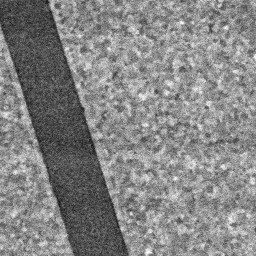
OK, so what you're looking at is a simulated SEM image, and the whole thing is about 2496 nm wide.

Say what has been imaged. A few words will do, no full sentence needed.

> one or a few lines or trenches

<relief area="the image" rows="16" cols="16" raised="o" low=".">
...ooooooooooooo
....oooooooooooo
....oooooooooooo
....oooooooooooo
o....ooooooooooo
o....ooooooooooo
o....ooooooooooo
oo....oooooooooo
oo....oooooooooo
oo....oooooooooo
ooo....ooooooooo
ooo....ooooooooo
ooo....ooooooooo
oooo...ooooooooo
oooo....oooooooo
oooo....oooooooo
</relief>